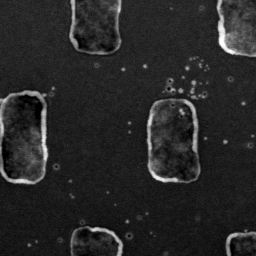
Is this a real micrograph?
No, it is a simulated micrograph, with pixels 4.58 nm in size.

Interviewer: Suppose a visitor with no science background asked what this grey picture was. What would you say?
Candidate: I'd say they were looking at raised bodies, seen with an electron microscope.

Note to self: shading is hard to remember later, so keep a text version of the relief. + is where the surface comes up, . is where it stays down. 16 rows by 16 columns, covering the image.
....+++.......++
....+++.......++
....+++.......++
................
................
................
+++.......++....
+++......+++....
+++......+++....
+++......+++....
+++......+++....
................
................
................
.....++.........
....++++......++